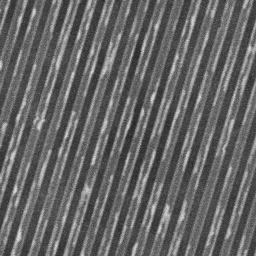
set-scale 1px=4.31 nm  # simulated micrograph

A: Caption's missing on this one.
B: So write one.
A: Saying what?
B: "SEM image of parallel lines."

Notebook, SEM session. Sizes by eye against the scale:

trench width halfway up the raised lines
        36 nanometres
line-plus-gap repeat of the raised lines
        71.8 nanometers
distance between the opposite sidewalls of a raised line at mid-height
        36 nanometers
